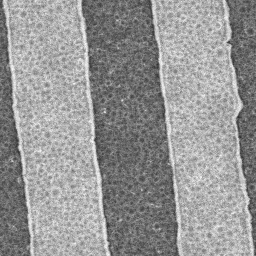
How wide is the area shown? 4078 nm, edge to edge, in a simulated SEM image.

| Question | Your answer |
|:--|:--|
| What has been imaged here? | one or a few lines or trenches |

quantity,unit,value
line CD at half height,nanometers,1150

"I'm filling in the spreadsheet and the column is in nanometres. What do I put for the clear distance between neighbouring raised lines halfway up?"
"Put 1180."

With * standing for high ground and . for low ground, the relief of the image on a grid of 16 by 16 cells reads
*****.....****..
.****.....****..
.****.....****..
.****.....****..
.****.....*****.
.*****....*****.
.*****....*****.
.*****....*****.
.*****.....****.
.*****.....****.
.*****.....****.
..****.....****.
..****.....****.
..****.....*****
..*****....*****
..*****....*****